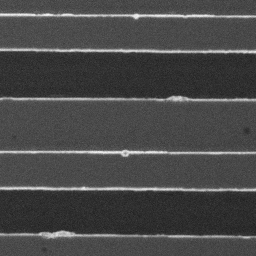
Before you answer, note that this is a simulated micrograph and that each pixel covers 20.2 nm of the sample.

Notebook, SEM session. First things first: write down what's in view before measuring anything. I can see lines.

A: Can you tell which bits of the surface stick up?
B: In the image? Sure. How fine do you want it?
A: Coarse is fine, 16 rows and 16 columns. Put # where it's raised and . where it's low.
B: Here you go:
################
################
################
................
................
................
################
################
################
################
################
################
................
................
................
################